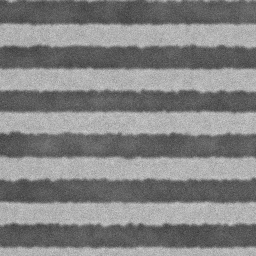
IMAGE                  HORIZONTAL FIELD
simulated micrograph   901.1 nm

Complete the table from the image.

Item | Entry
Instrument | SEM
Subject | lines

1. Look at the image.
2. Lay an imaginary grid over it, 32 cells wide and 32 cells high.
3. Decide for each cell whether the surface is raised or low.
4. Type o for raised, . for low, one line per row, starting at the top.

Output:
................................
................................
................................
oooooooooooooooooooooooooooooooo
oooooooooooooooooooooooooooooooo
oooooooooooooooooooooooooooooooo
................................
................................
................................
oooooooooooooooooooooooooooooooo
oooooooooooooooooooooooooooooooo
................................
................................
................................
oooooooooooooooooooooooooooooooo
oooooooooooooooooooooooooooooooo
o..ooooo.oooo.oooooooooooooooooo
................................
................................
................................
oooooooooooooooooooooooooooooooo
oooooooooooooooooooooooooooooooo
................................
................................
................................
oooooooooooooooooooooooooooooooo
oooooooooooooooooooooooooooooooo
oooooooooooooooooooooooooooooooo
................................
................................
................................
oooooooooooooooooooooooooooooooo